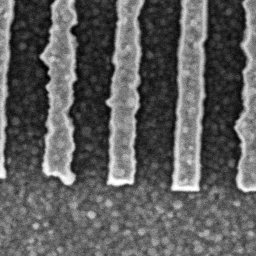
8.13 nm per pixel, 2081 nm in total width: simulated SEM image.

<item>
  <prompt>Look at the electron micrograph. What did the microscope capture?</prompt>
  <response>one or a few lines or trenches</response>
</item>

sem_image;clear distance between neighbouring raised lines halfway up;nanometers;342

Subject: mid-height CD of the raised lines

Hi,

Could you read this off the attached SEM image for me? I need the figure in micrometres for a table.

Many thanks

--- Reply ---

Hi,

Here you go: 0.19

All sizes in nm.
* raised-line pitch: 528